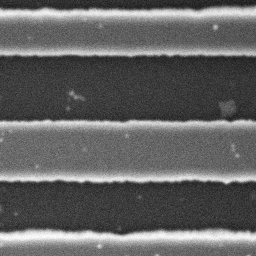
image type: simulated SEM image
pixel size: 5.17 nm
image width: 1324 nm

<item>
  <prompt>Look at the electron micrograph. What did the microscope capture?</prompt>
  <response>lines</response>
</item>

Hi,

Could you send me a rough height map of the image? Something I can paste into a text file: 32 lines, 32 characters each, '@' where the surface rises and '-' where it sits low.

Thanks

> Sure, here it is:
--------------------------------
-------------------------------@
@@@@@@@@@@@@@@@@@@@@@@@@@@@@@@@@
@@@@@@@@@@@@@@@@@@@@@@@@@@@@@@@@
@@@@@@@@@@@@@@@@@@@@@@@@@@@@@@@@
@@@@@@@@@@@@@@@@@@@@@@@@@@@@@@@@
@@@@@@@@@@@@@@@@@@@@@@@@@@@@@@@@
--------------------------------
--------------------------------
--------------------------------
--------------------------------
--------------------------------
--------------------------------
--------------------------------
--------------------------------
@@@@@@@@@@@@@@@@@@@@@@@@@@@@@@@@
@@@@@@@@@@@@@@@@@@@@@@@@@@@@@@@@
@@@@@@@@@@@@@@@@@@@@@@@@@@@@@@@@
@@@@@@@@@@@@@@@@@@@@@@@@@@@@@@@@
@@@@@@@@@@@@@@@@@@@@@@@@@@@@@@@@
@@@@@@@@@@@@@@@@@@@@@@@@@@@@@@@@
@@@@@@@@@@@@@@@@@@@@@@@@@@@@@@@@
@@@@@---@@@@@@--@@@@@@---@@@@@@-
--------------------------------
--------------------------------
--------------------------------
--------------------------------
--------------------------------
--------------------------------
---@@@@@@-@@-@-----@@@@@@@@@@-@-
@@@@@@@@@@@@@@@@@@@@@@@@@@@@@@@@
@@@@@@@@@@@@@@@@@@@@@@@@@@@@@@@@